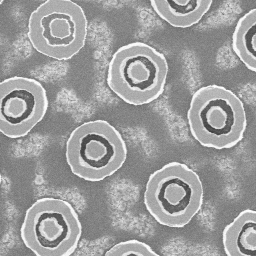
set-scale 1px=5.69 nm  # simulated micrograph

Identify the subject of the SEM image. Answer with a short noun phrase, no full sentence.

ring-shaped raised bodies with a dot in the middle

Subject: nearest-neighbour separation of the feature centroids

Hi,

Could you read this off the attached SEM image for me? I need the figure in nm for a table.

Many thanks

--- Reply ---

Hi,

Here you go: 499